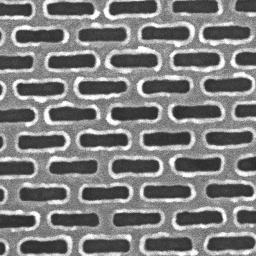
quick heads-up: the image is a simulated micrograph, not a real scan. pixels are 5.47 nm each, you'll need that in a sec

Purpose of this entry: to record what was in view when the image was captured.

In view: a regular array of holes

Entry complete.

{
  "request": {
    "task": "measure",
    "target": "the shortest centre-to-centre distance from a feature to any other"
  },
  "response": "220 nanometres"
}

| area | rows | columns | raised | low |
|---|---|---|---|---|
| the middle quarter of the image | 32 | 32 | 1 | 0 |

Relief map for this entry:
00000000111100000000000111110000
11111111111111111111111111111111
11111111111111111111111111111111
11111111111111111111111111111111
11110000000000011111000000000001
11110000000000001111000000000000
11110000000000001111000000000001
11110000000111111111001111111011
11111111111111111111111111111111
11111111111111111111111111111111
11111111111111111111111111110001
00000000111100000000000011100000
00000000111100000000000011100000
00000000111100000000000111110000
11111111111111111111111111111111
11111111111111111111111111111111
11111111111111111111111111111111
11111001111000011111000000000000
11110000000000001111000000000000
11110000000000001111000000000000
11110000000000001111100000111111
11111111111111111111111111111111
11111111111111111111111111111111
11111111111111111111111111111001
00000000111100000000000011110000
00000000111100000000000011100000
00000000111100000000000011110000
00110001111111111111111111111111
11111111111111111111111111111111
11111111111111111111111111111111
11111111111100011111000000000011
01111000000000001111000000000000